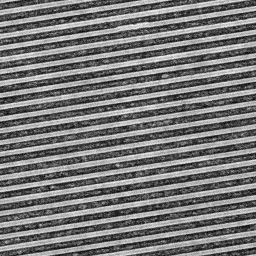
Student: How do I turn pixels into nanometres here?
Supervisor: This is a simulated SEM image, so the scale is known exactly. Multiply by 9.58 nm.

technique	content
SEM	parallel lines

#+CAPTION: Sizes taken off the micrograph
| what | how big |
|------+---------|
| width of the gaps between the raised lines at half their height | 80.4 nm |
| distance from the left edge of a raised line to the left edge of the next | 0.112 micrometres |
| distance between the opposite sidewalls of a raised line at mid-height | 35.5 nm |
